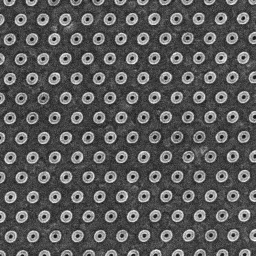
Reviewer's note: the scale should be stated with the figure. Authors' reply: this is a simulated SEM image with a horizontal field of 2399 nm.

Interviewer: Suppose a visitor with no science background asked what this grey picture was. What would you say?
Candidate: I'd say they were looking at a regular array of ring-shaped raised bodies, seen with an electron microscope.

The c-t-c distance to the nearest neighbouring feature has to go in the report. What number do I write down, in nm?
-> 207